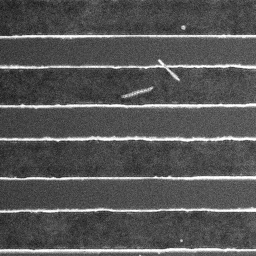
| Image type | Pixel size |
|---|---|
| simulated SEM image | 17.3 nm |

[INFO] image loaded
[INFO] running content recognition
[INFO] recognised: lines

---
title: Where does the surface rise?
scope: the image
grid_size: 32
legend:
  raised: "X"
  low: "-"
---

--------------------------------
--------------------------------
--------------------------------
--------------------------------
---XXXXX-XXXXXXXXXXXXXXXXXXXXXXX
XXXXXXXXXXXXXXXXXXXXXXXXXXXXXXXX
XXXXXXXXXXXXXXXXXXXXXXXXXXXXXXXX
XXXXXXXXXXXXXXXXXXXXXXXXXXXXXXXX
--------------------------------
--------------------------------
--------------------------------
--------------------------------
--------------------------------
XXXXXXXXXXXXXXXXXXXXXXXXXXXXXXXX
XXXXXXXXXXXXXXXXXXXXXXXXXXXXXXXX
XXXXXXXXXXXXXXXXXXXXXXXXXXXXXXXX
XXXXXXXXXXXXXXXXXXXXXXXXXXXXXXXX
--------------------------------
--------------------------------
--------------------------------
--------------------------------
--------------------------------
XXXXXXXXXXXXXXXXXXXXXXXXXXXXXXXX
XXXXXXXXXXXXXXXXXXXXXXXXXXXXXXXX
XXXXXXXXXXXXXXXXXXXXXXXXXXXXXXXX
XXXXXXXXXXXXXXXXXXXXXXXXXXXXXXXX
--------------------------------
--------------------------------
--------------------------------
--------------------------------
--------------------------------
XXXXXXXXXXXXXXXXXXXXXXXXXXXXXXXX